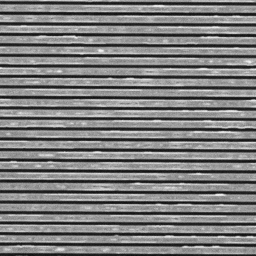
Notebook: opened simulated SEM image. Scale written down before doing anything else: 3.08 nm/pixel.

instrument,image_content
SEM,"parallel lines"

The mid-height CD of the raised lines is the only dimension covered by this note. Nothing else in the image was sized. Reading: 22.3 nm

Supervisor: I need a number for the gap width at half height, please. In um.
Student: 0.0112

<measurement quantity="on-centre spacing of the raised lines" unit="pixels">10.5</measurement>